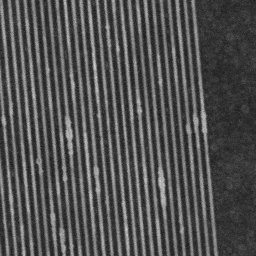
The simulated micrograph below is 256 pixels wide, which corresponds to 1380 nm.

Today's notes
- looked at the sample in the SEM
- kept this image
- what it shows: parallel lines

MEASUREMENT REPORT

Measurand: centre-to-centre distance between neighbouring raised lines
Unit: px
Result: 7.98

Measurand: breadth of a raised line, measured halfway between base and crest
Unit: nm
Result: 16.1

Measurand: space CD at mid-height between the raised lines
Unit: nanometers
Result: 26.9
